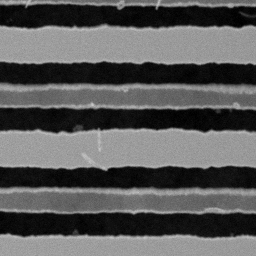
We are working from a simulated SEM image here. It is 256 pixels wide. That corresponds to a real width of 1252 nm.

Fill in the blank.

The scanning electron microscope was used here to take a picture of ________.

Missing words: lines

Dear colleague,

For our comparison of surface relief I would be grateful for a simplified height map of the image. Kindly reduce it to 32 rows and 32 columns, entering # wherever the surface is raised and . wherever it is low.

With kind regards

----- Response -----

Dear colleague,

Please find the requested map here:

#####.....######################
................................
................................
###..###########################
################################
################################
################################
################################
................................
................................
#...............##..............
################################
################################
.....###########################
................................
................................
######.#.#######################
################################
################################
################################
################################
................................
................................
.#...#.#........................
################################
################################
..##############################
................................
................................
##...######....#....####......#.
################################
################################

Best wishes